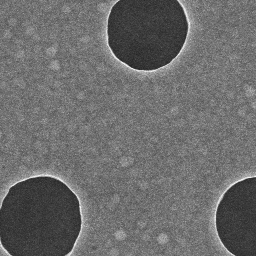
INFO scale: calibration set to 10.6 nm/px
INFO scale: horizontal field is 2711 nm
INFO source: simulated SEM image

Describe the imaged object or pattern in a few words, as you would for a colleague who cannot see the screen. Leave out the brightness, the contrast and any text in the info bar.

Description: holes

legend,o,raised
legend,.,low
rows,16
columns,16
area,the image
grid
ooooooo....ooooo
ooooooo.....oooo
ooooooo.....oooo
ooooooo....ooooo
oooooooooooooooo
oooooooooooooooo
oooooooooooooooo
oooooooooooooooo
oooooooooooooooo
oooooooooooooooo
oooooooooooooooo
o...ooooooooooo.
.....ooooooooo..
.....oooooooo...
.....ooooooooo..
.....ooooooooo..